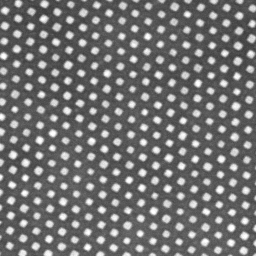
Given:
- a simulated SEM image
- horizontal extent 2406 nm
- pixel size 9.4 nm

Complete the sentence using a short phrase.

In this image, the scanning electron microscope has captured a regular array of raised bodies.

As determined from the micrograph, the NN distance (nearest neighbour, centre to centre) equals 139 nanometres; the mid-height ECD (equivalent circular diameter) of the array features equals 66.2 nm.